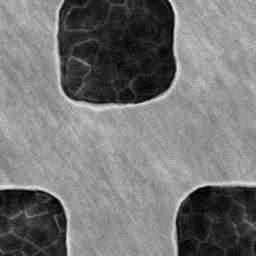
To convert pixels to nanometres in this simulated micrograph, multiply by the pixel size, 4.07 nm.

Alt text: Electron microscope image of holes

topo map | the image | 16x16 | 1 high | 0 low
1111000000011111
1111000000011111
1111000000011111
1111000000011111
1111000000011111
1111000000011111
1111110011111111
1111111111111111
1111111111111111
1111111111111111
1111111111111111
1111111111111111
0000111111110000
0000111111100000
0000111111100000
0000111111100000